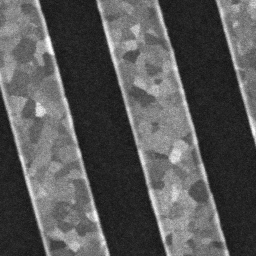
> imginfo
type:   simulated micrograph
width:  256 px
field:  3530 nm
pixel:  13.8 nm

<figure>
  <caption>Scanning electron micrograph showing one or a few lines or trenches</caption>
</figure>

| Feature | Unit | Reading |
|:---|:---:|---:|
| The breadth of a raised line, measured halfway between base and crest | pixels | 56.7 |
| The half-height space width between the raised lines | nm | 806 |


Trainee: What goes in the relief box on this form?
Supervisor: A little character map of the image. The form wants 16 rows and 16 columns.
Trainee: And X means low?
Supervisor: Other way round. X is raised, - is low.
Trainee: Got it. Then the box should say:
XX----XXXX----XX
XXX----XXX----XX
XXX----XXXX---XX
XXX----XXXX----X
XXXX---XXXX----X
XXXX----XXX----X
XXXX----XXXX---X
-XXX----XXXX----
-XXXX---XXXX----
-XXXX----XXX----
--XXX----XXXX---
--XXX----XXXX---
--XXXX----XXX---
--XXXX----XXXX--
---XXX----XXXX--
---XXXX---XXXX--